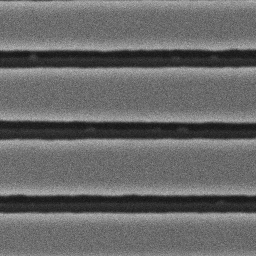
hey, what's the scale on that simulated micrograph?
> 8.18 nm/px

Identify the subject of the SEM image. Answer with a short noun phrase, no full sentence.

lines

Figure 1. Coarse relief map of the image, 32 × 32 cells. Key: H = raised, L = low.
HHHHHHHHHHHHHHHHHHHHHHHHHHHHHHHH
HHHHHHHHHHHHHHHHHHHHHHHHHHHHHHHH
HHHHHHHHHHHHHHHHHHHHHHHHHHHHHHHH
HHHHHHHHHHHHHHHHHHHHHHHHHHHHHHHH
HHHHHHHHHHHHHHHHHHHHHHHHHHHHHHHH
HHHHHHHHHHHHHHHHHHHHHHHHHHHHHHHH
LLLLLLLLLLLLLLLLLLLLLLLLLLLLLLLL
LLLLLLLLLLLLLLLLLLLLLLLLLLLLLLLL
LLLLHHHHHHLLHHHHHHHHHHHHHHHHHHHH
HHHHHHHHHHHHHHHHHHHHHHHHHHHHHHHH
HHHHHHHHHHHHHHHHHHHHHHHHHHHHHHHH
HHHHHHHHHHHHHHHHHHHHHHHHHHHHHHHH
HHHHHHHHHHHHHHHHHHHHHHHHHHHHHHHH
HHHHHHHHHHHHHHHHHHHHHHHHHHHHHHHH
HHHHHHHHHHHHHHHHHHHHHHHHHHHHHHHH
LLLLLLLLLLLLLLLLLLLLLLLLLLLLLLLL
LLLLLLLLLLLLLLLLLLLLLLLLLLLLLLLL
LHHLHLLLLLHHHHHHHHHHHHHHHHHHHHHH
HHHHHHHHHHHHHHHHHHHHHHHHHHHHHHHH
HHHHHHHHHHHHHHHHHHHHHHHHHHHHHHHH
HHHHHHHHHHHHHHHHHHHHHHHHHHHHHHHH
HHHHHHHHHHHHHHHHHHHHHHHHHHHHHHHH
HHHHHHHHHHHHHHHHHHHHHHHHHHHHHHHH
HHHHHHHHHHHHHHHHHHHHHHHHHHHHHHHH
LLLLLLLLLLLLLLLLLLLLLLLLLLLLLLLL
LLLLLLLLLLLLLLLLLLLLLLLLLLLLLLLL
LLLLLLLLLLLLLLLLLLLLLLLLLLLLLLLL
HHHHHHHHHHHHHHHHHHHHHHHHHHHHHHHH
HHHHHHHHHHHHHHHHHHHHHHHHHHHHHHHH
HHHHHHHHHHHHHHHHHHHHHHHHHHHHHHHH
HHHHHHHHHHHHHHHHHHHHHHHHHHHHHHHH
HHHHHHHHHHHHHHHHHHHHHHHHHHHHHHHH